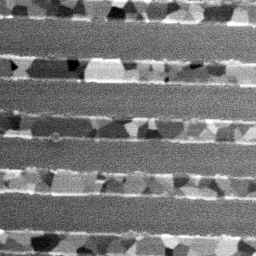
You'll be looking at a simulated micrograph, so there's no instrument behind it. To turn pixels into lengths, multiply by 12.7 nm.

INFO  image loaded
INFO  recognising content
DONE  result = lines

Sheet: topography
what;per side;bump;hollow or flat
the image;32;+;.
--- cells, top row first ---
++++++++++++++++++++++++++++++++
++++++++++++++++++++++++++++++++
..............++++++++++++++++++
................................
................................
................................
................................
+++++++++++.....................
++++++++++++++++++++++++++++++++
++++++++++++++++++++++++++++++++
.........................+++++++
................................
................................
................................
+++++++.........................
++++++++++++++++++++++++++++++++
++++++++++++++++++++++++++++++++
.............+++++++++++++++++++
................................
................................
................................
++++++++...+....................
++++++++++++++++++++++++++++++++
++++++++++++++++++++++++++++++++
.....................+++++++++++
................................
................................
................................
................................
++++++++++++++++++++............
++++++++++++++++++++++++++++++++
.+++++++++++++++++++++++++++++++